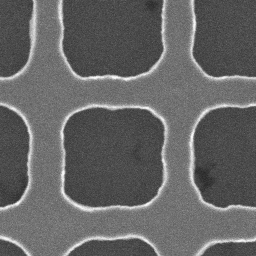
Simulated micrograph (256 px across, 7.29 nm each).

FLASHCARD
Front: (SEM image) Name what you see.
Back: holes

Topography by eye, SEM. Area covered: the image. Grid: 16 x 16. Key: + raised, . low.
..++......++....
..++......++....
..++......++....
..++......++....
.++++....++++...
++++++++++++++++
++++++++++++++++
.+++......++....
..++......++....
..++......++....
..++......++....
..++......++....
.+++.....++++...
++++++++++++++++
++++++++++++++++
.++++.....+++...